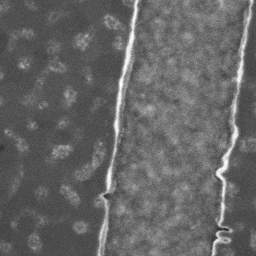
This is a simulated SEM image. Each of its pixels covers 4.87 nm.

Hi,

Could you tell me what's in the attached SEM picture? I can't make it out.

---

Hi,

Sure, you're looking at one or a few lines or trenches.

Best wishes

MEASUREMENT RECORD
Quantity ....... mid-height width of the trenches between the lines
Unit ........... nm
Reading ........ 553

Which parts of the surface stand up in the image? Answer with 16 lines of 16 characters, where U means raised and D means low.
UUUUUUUUDDDDDDDD
UUUUUUUUDDDDDDDU
UUUUUUUUDDDDDDDU
UUUUUUUUDDDDDDDU
UUUUUUUUDDDDDDDU
UUUUUUUUDDDDDDDU
UUUUUUUDDDDDDDDU
UUUUUUUDDDDDDDDU
UUUUUUUDDDDDDDDU
UUUUUUUDDDDDDDUU
UUUUUUUDDDDDDDUU
UUUUUUUDDDDDDDUU
UUUUUUUDDDDDDDUU
UUUUUUUDDDDDDDUU
UUUUUUDDDDDDDDUU
UUUUUUDDDDDDDUUU